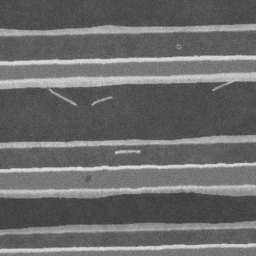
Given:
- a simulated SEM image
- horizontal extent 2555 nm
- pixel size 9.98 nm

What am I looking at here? lines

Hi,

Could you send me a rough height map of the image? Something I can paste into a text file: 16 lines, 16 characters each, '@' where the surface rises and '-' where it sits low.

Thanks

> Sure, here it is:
----------------
----------------
@@@@@@@@@@@@@@@@
@@@@@@@@@@@@@@@@
@@@@@@@@@@@@@@@@
----------------
----------------
----------------
----------------
@@@@@@@@@@@@@@@@
@@@@@@@@@@@@@@@@
@@@@@@@@@@@@@@@@
----------------
----------------
--@@@@@@@@@@@@@@
@@@@@@@@@@@@@@@@